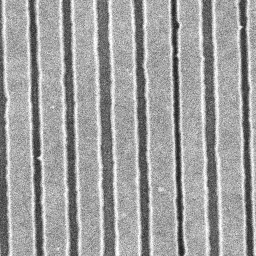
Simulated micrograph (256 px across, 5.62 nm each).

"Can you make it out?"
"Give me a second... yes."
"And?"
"parallel lines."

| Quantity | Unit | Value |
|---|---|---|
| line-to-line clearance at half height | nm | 56.9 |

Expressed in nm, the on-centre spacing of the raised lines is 197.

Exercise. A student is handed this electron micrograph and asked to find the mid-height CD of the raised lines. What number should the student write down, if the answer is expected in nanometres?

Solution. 142